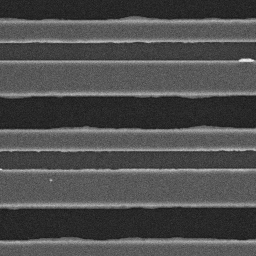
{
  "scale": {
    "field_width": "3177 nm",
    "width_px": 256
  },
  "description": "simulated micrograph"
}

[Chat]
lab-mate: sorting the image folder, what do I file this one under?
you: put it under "lines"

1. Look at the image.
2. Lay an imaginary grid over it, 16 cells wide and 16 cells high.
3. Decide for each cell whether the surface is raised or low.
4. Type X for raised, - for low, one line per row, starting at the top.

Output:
----------------
XXXXXXXXXXXXXXXX
XXXXXXXXXXXXXXXX
XXXXXXXXXXXXXXXX
XXXXXXXXXXXXXXXX
XXXXXXXXXXXXXXXX
----------------
----------------
XXXXXXXXXXXXXXXX
XXXXXXXXXXXXXXXX
XXXXXXXXXXXXXXXX
XXXXXXXXXXXXXXXX
XXXXXXXXXXXXXXXX
----------------
----------------
XXXXXXXXXXXXXXXX